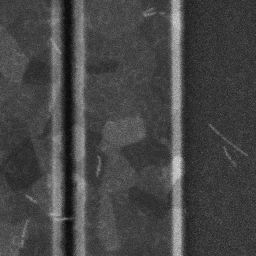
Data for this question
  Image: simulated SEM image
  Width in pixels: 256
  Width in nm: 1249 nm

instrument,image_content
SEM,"one or a few lines or trenches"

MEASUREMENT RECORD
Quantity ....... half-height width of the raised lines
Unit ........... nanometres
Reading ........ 470